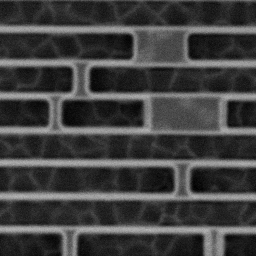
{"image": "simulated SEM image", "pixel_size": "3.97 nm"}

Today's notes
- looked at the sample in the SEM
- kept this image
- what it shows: parallel lines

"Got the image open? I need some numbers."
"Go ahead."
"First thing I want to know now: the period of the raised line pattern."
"0.132 um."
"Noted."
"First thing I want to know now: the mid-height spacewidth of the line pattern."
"27.1 px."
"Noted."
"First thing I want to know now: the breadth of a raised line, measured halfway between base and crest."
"0.0233 µm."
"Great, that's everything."